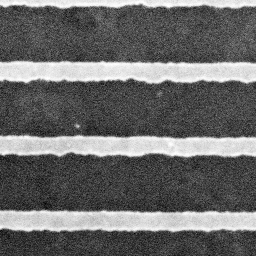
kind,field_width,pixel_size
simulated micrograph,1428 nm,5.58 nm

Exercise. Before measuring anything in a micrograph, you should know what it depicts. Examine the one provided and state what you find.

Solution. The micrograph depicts lines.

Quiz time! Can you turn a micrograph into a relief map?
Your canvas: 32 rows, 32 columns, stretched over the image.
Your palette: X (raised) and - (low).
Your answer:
XXXXXXXXXXXXXXXXX-XXXXXXXXXXXXXX
--------------------------------
--------------------------------
--------------------------------
--------------------------------
--------------------------------
--------------------------------
--------------------------------
XXXXXXXXXXXXXXXXXXXXXXXXXXXXXXXX
XXXXXXXXXXXXXXXXXXXXXXXXXXXXXXXX
--------------------------------
--------------------------------
--------------------------------
--------------------------------
--------------------------------
--------------------------------
--------------------------------
XXXXXXXXXXXXXXXXXXXXXXXXXXXXXXXX
XXXXXXXXXXXXXXXXXXXXXXXXXXXXXXXX
----------------X------X--------
--------------------------------
--------------------------------
--------------------------------
--------------------------------
--------------------------------
--------------------------------
XX--XX--X-----------------------
XXXXXXXXXXXXXXXXXXXXXXXXXXXXXXXX
XXXXXXXXXXXXXXXXXXXXXXXXXXXXXXXX
--------------------------------
--------------------------------
--------------------------------